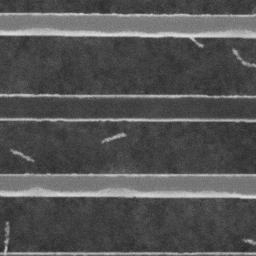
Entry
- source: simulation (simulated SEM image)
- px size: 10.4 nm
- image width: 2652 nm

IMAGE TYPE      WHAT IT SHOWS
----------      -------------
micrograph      lines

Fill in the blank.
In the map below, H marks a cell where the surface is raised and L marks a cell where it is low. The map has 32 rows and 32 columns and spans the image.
LLLLLLLLLLLLLLLLLLLLLLLLLLLLLLLL
LLLLLLLLLLLLLLLLLLLLLLLLLLLLLLLL
HHHHHHHHHHHHHHHHHHHHHHHHHHHHHHHH
HHHHHHHHHHHHHHHHHHHHHHHHHHHHHHHH
LLLLLLLLLLLLLLLLLLLLLLLHLLLLLLLL
LLLLLLLLLLLLLLLLLLLLLLLLLLLLLLLL
LLLLLLLLLLLLLLLLLLLLLLLLLLLLLLLL
LLLLLLLLLLLLLLLLLLLLLLLLLLLLLLLL
LLLLLLLLLLLLLLLLLLLLLLLLLLLLLLLL
LLLLLLLLLLLLLLLLLLLLLLLLLLLLLLLL
LLLLLLLLLLLLLLLLLLLLLLLLLLLLLLLL
LLLLLLLLLLLLLLLLLLLLLLLLLLLLLLLL
HHHHHHHHHHHHHHHHHHHHHHHHHHHHHHHH
HHHHHHHHHHHHHHHHHHHHHHHHHHHHHHHH
HHHHHHHHHHHHHHHHHHHHHHHHHHHHHHHH
LLLLLLLLLLLLLLLLLLLLLLLLLLLLLLLL
LLLLLLLLLLLLLLLLLLLLLLLLLLLLLLLL
LLLLLLLLLLLLLLLLLLLLLLLLLLLLLLLL
LLLLLLLLLLLLLLLLLLLLLLLLLLLLLLLL
LLLLLLLLLLLLLLLLLLLLLLLLLLLLLLLL
LLLLLLLLLLLLLLLLLLLLLLLLLLLLLLLL
LLLLLLLLLLLLLLLLLLLLLLLLLLLLLLLL
HHHHHHHHHHHHHHHHHHHHHHHHHHHHHHHH
HHHHHHHHHHHHHHHHHHHHHHHHHHHHHHHH
LLLLLLLLLLLLLLLLLLLLLLLLLLLLHHHH
LLLLLLLLLLLLLLLLLLLLLLLLLLLLLLLL
LLLLLLLLLLLLLLLLLLLLLLLLLLLLLLLL
LLLLLLLLLLLLLLLLLLLLLLLLLLLLLLLL
LLLLLLLLLLLLLLLLLLLLLLLLLLLLLLLL
LLLLLLLLLLLLLLLLLLLLLLLLLLLLLLLL
LLLLLLLLLLLLLLLLLLLLLLLLLLLLLLLL
LLLLLLLLLLLLLLLLLLLLLLLLLLLLLLLL